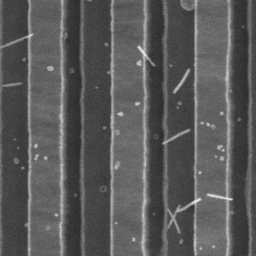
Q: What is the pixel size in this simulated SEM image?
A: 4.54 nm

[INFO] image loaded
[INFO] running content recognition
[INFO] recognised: lines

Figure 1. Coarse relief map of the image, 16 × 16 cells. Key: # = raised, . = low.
..##...##...##..
..##...##...##..
..##...##...##..
..##...##...##..
..##...##...##..
..##...##...##..
..##...##...##..
..##...##...##..
..##...##...##..
..##...##...##..
..##...##...##..
..##...##...##..
..##...##...##..
..##...##...##..
..##...##...##..
..##...##...##..